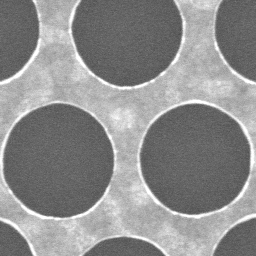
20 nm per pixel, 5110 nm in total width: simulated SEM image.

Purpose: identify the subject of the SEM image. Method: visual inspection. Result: holes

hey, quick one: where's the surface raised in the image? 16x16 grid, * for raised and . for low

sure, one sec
..***......***..
..**.......**...
..***......**...
..***......***..
.*****....*****.
****************
***.********.***
*.....****.....*
.......**......*
.......**.......
.......**.......
.......**......*
*.....****.....*
***..***********
.*************..
..****....***...